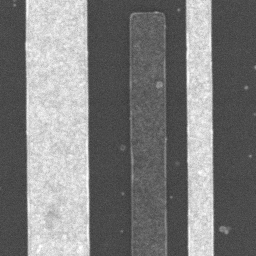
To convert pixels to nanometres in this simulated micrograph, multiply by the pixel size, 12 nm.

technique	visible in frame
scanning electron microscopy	groups of lines, slits or small figures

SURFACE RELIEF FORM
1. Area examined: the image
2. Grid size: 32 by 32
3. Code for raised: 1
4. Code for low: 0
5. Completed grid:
00011111111000000000000111000000
00011111111000000000000111000000
00011111111000001111100111000000
00011111111000001111100111000000
00011111111000001111100111000000
00011111111000001111100111000000
00011111111000001111100111000000
00011111111000001111100111000000
00011111111000001111100111000000
00011111111000001111100111000000
00011111111000001111100111000000
00011111111000001111100111000000
00011111111000001111100111000000
00011111111000001111100011000000
00011111111000001111100011000000
00011111111000001111100011000000
00011111111000001111100011000000
00011111111000001111100011000000
00011111111000001111100011000000
00001111111000000111100011000000
00001111111000000111100011000000
00001111111000000111100011000000
00001111111000000111100011100000
00001111111000000111100011100000
00001111111000000111100011100000
00001111111000000111100011100000
00001111111000000111100011100000
00001111111000000111100011100000
00001111111000000111100011100000
00001111111000000111100011100000
00001111111000000111100011100000
00001111111000000111100011100000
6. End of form